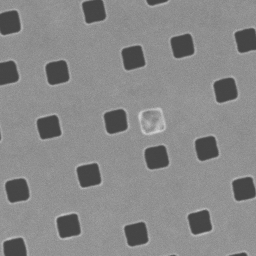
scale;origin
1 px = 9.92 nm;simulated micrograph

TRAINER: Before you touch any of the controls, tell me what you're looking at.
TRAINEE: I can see a regular array of holes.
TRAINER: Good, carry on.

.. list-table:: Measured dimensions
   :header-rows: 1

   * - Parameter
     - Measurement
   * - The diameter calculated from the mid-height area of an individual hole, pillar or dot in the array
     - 0.246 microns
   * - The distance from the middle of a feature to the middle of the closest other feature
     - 0.541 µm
